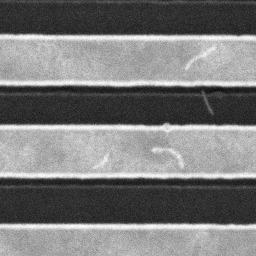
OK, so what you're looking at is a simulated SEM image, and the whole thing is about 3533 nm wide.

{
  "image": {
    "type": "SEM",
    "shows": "lines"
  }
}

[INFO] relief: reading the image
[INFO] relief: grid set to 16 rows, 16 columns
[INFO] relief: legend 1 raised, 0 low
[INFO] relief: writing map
0000000000000000
0000000000000000
1111111111111111
1111111111111111
1111111111111111
0000000000000000
0000000000000000
0000000000000000
1111111111111111
1111111111111111
1111111111111111
0000000000000000
0000000000000000
0000000000000000
1111111111111111
1111111111111111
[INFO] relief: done